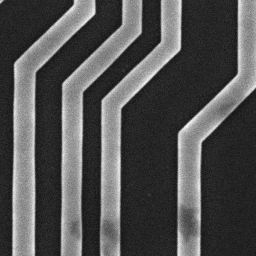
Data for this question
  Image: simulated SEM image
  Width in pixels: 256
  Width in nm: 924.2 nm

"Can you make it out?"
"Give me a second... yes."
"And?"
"groups of lines, slits or small figures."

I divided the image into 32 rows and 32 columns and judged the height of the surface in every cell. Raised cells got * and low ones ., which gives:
.........***...***..***.......**
........****...***..***.......**
.......****....***..***.......**
......****.....***..***.......**
.....****.....***...***.......**
....****.....***....***.......**
...****.....***....***........**
..****.....***....***.........**
..***.....***....***..........**
..**.....***....***..........***
..**....***....***...........***
..**....**....***...........***.
..**....**...***..........****..
..**....**...**..........****...
..**....**...**.........****....
..**....**...**........****.....
..**....**...**.......****......
..**....**...**.......***.......
..**....**...**.......***.......
..**....**...**.......***.......
..**....**...**.......***.......
..**....**...**.......***.......
..**....**...**.......***.......
..**....**...**.......***.......
..**....**...**.......***.......
..**....**...**.......***.......
..**....**...**.......***.......
..**....**...**.......***.......
..**....**...**.......***.......
..**....**...**.......***.......
..**....**...**.......***.......
..**....**...**.......***.......